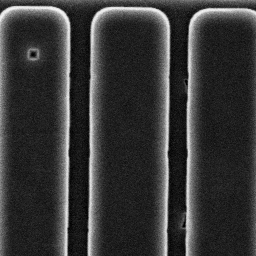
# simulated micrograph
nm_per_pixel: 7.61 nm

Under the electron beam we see wiring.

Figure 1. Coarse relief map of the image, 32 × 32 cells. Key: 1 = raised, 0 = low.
00000000000000000000000000000000
01111111000001111111000001111111
11111111000011111111100011111111
11111111100111111111100011111111
11111111100111111111100011111111
11111111100111111111100011111111
11111111100111111111100011111111
11111111100111111111100011111111
11111111100111111111100011111111
11111111100111111111100011111111
11111111100111111111100011111111
11111111000111111111100011111111
11111111000111111111100011111111
11111111100111111111100011111111
11111111100111111111100011111111
11111111100111111111100011111111
11111111000111111111100011111111
11111111000111111111100011111111
11111111000111111111100011111111
11111111000111111111100011111111
11111111000111111111100011111111
11111111000111111111100011111111
11111111000111111111100111111111
11111111000111111111100111111111
11111111000111111111100111111111
11111111000111111111100111111111
11111111000111111111100111111111
11111111000111111111100111111111
11111111000111111111100111111111
11111111000111111111100111111111
11111111000111111111100111111111
11111111000111111111100111111111